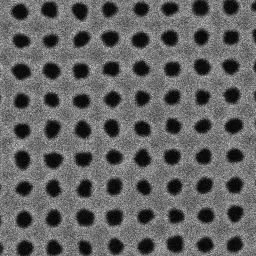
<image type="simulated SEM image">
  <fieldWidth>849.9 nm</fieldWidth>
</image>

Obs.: a regular array of holes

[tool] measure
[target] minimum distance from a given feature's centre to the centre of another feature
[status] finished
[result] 96.1 nanometers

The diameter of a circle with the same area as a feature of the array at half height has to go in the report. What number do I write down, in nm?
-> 51.5